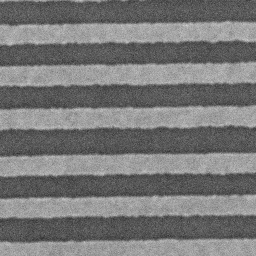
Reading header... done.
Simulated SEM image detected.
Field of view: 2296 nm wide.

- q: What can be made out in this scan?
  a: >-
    lines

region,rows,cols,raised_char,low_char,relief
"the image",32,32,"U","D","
DDDDDDDDDDDDDDDDDDDDDDDDDDDDDDDD
DDDDDDDDDDDDDDDDDDDDDDDDDDDDDDDD
DDDDDDDDDDDDDDDDDDDDDDDDDDDDDDDD
UUUUUUUUUUUUUUUUUUUUUUUUUUUUUUUU
UUUUUUUUUUUUUUUUUUUUUUUUUUUUUUUU
DUDDDDDDDDDDDDDDDDDDDDDDDDDDDDDD
DDDDDDDDDDDDDDDDDDDDDDDDDDDDDDDD
DDDDDDDDDDDDDDDDDDDDDDDDDDDDDDDD
UUUUUUUUUUUUUUUUUUUUUUUUUUUUUUUU
UUUUUUUUUUUUUUUUUUUUUUUUUUUUUUUU
UUUUUUUUUUUUDDDDUUDDDDDDDDDDDDDD
DDDDDDDDDDDDDDDDDDDDDDDDDDDDDDDD
DDDDDDDDDDDDDDDDDDDDDDDDDDDDDDDD
DDDDDDDDDDDDDDDDDDDDDDDUUUUUUUUU
UUUUUUUUUUUUUUUUUUUUUUUUUUUUUUUU
UUUUUUUUUUUUUUUUUUUUUUUUUUUUUUUU
DDDDDDDDDDDDDDDDDDDDDDDDDDDDDDDD
DDDDDDDDDDDDDDDDDDDDDDDDDDDDDDDD
DDDDDDDDDDDDDDDDDDDDDDDDDDDDDDDD
DDDDDUUUUUUUUUUUUUUUUUUUUUUUUUUU
UUUUUUUUUUUUUUUUUUUUUUUUUUUUUUUU
UUUUUUUUUUUUUUUUUUUUUUUUUUUUUUUU
DDDDDDDDDDDDDDDDDDDDDDDDDDDDDDDD
DDDDDDDDDDDDDDDDDDDDDDDDDDDDDDDD
DDDDDDDDDDDDDDDDDDDDDDDDDDDDDUUU
UUUUUUUUUUUUUUUUUUUUUUUUUUUUUUUU
UUUUUUUUUUUUUUUUUUUUUUUUUUUUUUUU
DDDDDDDDDDDDDDDDDDDDDDDDDDDDDDDD
DDDDDDDDDDDDDDDDDDDDDDDDDDDDDDDD
DDDDDDDDDDDDDDDDDDDDDDDDDDDDDDDD
UUUUUUUUUUUUUUUUUUUUUUUUUUUUUUUU
UUUUUUUUUUUUUUUUUUUUUUUUUUUUUUUU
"